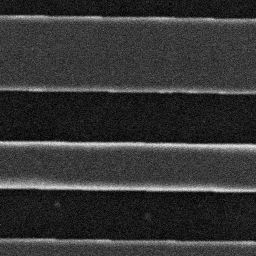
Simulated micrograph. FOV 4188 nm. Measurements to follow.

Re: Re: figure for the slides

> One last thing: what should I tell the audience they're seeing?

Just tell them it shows lines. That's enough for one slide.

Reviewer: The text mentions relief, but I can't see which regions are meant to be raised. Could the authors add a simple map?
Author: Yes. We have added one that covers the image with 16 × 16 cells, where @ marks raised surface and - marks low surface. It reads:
----------------
@@@@@@@@@@@@@@@@
@@@@@@@@@@@@@@@@
@@@@@@@@@@@@@@@@
@@@@@@@@@@@@@@@@
@@@@@@@@@@@@@@@@
----------------
----------------
----------------
@@@@@@@@@@@@@@@@
@@@@@@@@@@@@@@@@
@@@@@@@@@@@@@@@@
----------------
----------------
----------------
@@@@@@@@@@@@@@@@